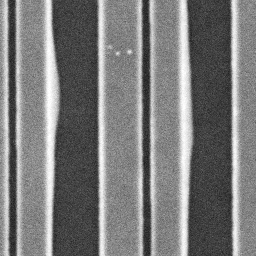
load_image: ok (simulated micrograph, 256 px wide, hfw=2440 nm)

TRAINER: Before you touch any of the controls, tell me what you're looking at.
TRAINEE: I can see lines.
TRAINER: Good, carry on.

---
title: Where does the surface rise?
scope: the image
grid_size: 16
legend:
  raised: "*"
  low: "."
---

***...*****....*
***...*****....*
***...*****....*
***...******...*
***...******...*
***...******...*
***...******...*
***...******...*
***...******...*
***...******...*
***...******...*
***...******...*
***...******...*
***...******...*
***...******...*
***...******...*